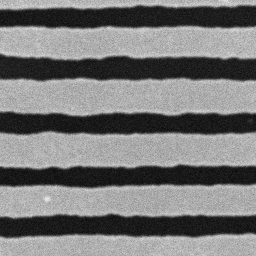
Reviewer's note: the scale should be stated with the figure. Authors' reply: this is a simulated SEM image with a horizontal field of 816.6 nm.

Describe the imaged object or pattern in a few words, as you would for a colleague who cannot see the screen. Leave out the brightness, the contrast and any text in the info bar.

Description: lines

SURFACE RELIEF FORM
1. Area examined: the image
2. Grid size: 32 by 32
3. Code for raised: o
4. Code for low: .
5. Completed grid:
oooooooooooooooooooooooooooooooo
................................
................................
oooooo.oo...oooooooooooooooo.ooo
oooooooooooooooooooooooooooooooo
oooooooooooooooooooooooooooooooo
oooooooooooooooooooooooooooooooo
................................
................................
................................
oooooooooooooooooooooooooooooooo
oooooooooooooooooooooooooooooooo
oooooooooooooooooooooooooooooooo
oooooooooooooooooooooooooooooooo
................................
................................
......o.........................
oooooooooooooooooooooooooooooooo
oooooooooooooooooooooooooooooooo
oooooooooooooooooooooooooooooooo
oooooooooooooooooooooooooooooooo
................................
................................
oooooooooooooooooooooooooooooooo
oooooooooooooooooooooooooooooooo
oooooooooooooooooooooooooooooooo
oooooooooooooooooooooooooooooooo
................................
................................
.......ooooooooo.....o....oooooo
oooooooooooooooooooooooooooooooo
oooooooooooooooooooooooooooooooo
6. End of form